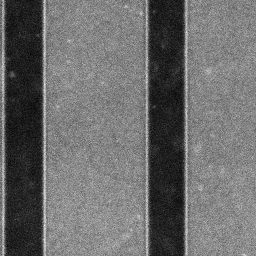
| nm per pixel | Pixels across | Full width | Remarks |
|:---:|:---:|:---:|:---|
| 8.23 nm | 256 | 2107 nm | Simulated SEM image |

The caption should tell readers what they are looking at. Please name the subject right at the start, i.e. one or a few lines or trenches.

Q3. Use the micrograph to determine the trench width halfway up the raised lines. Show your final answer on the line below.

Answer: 828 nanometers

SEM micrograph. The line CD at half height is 42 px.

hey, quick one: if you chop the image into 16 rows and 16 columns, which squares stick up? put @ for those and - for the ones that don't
@@@------@@@----
@@@------@@@----
@@@------@@@----
@@@------@@@----
@@@------@@@----
@@@------@@@----
@@@------@@@----
@@@------@@@----
@@@------@@@----
@@@------@@@----
@@@------@@@----
@@@------@@@----
@@@------@@@----
@@@------@@@----
@@@------@@@----
@@@------@@@----